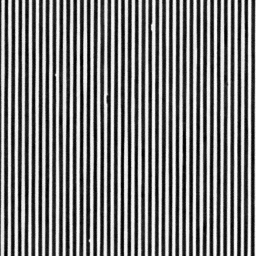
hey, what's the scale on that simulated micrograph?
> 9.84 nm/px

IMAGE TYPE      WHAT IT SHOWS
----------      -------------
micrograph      parallel lines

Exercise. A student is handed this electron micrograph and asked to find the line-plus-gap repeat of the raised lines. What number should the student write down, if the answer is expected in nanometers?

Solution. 67.4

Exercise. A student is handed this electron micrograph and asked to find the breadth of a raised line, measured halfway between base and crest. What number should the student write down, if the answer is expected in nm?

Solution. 34.4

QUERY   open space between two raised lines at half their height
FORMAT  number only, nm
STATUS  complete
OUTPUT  35.7